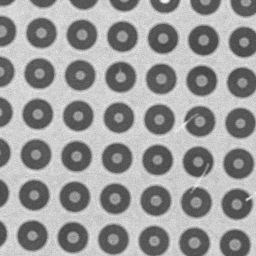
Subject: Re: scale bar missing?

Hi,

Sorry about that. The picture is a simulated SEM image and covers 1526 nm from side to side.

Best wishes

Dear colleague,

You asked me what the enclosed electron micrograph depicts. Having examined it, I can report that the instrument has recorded an array of small figures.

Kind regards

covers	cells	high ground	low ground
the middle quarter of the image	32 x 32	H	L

HLLLLLLLHHHLLLLLLHHHHHLLLLLHHHHH
LLLLLLLLHHLLLLLLLLHHHLLLLLLLHHHL
LLLHHLLLHHLLLHHLLLHHHLLLLLLLHHHL
LLLHHLLLHHLLLHHLLLHHLLLHHLLLHHLL
LLLLLLLLHHLLLLLLLLHHLLLLHLLLHHLL
HLLLLLLHHHHLLLLLLLHHHLLLLLLLHHHL
HHLLLLHHHHHLLLLLLHHHHLLLLLLHHHHL
HHHHHHHHHHHHHHHHHHHHHHHLLLHHHHHH
HHHHHHHHHHHHHHHHHHHHHHHHHHHHHHHH
HLLLLHHHHHHHHLLHHHHHHHHHHHHHHHHH
LLLLLLLHHHHLLLLLHHHHHLLLLLHHHHHH
LLLLLLLHHHLLLLLLLHHHLLLLLLLHHHHL
LLLHLLLLHHLLLLLLLLHHLLLLLLLLHHLL
LLLHLLLLHHLLLHHLLLHHLLLHHLLLHHLL
LLLLLLLHHHLLLLLLLLHHLLLHHLLLHHLL
LLLLLLLHHHLLLLLLLHHHLLLLLLLLHHLL
HLLLLLHHHHHLLLLLHHHHHLLLLLLHHHHL
HHHHHHHHHHHHHLHHHHHHHHLLLLHHHHHL
HHHHHHHHHHHHHHHHHHHHHHHHHHHHHHHH
HLLLLHHHHHHHLHHHHHHHHHHHHHHHHHHH
LLLLLLHHHHHLLLLLHHHHHLLLLHHHHHHH
LLLLLLLHHHLLLLLLLHHHLLLLLLLHHHHL
LLHHLLLHHLLLLHLLLHHHLLLLLLLHHHLL
LLHHLLLHHLLLHHLLLHHLLLLHLLLLHHLL
LLLLLLLHHLLLLLLLLHHLLLLHLLLHHLLL
LLLLLLHHHHLLLLLLLHHHLLLLLLLHHHLL
HLLLLHHHHHLLLLLLHHHHLLLLLLLHHHLL
HHHHHHHHHHHHLLHHHHHHHLLLLHHHHHHL
HHHHHHHHHHHHHHHHHHHHHHHHHHHHHHHH
HLLLHHHHHHHHHHHHHHHHHHHHHHHHHHHH
LLLLLHHHHHLLLLLHHHHHHHLLLHHHHHHH
LLLLLLHHHLLLLLLLHHHHLLLLLLHHHHLL